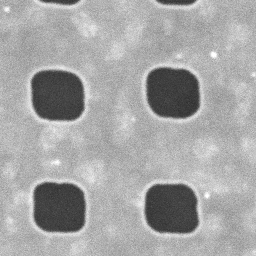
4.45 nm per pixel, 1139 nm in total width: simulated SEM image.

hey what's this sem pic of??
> holes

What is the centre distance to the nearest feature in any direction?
498 nm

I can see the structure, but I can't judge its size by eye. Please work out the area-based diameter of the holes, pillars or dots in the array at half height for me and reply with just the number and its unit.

0.249 micrometres